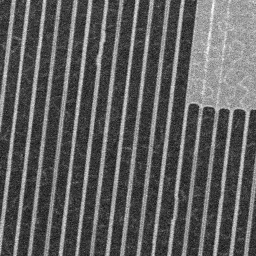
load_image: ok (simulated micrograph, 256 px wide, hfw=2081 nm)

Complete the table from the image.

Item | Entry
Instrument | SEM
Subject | parallel lines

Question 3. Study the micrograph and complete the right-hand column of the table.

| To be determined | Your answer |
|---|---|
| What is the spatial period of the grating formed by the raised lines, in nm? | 125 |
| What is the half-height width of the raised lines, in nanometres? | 20.2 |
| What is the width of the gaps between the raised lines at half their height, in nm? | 103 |